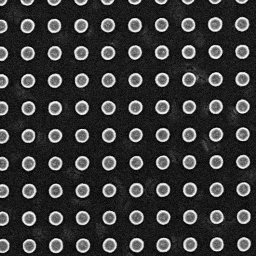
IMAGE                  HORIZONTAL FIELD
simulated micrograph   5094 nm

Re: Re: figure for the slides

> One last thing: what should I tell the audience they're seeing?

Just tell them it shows a regular array of raised bodies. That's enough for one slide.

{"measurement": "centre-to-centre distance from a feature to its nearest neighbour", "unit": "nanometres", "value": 528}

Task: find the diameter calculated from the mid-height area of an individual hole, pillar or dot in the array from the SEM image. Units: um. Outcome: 0.26